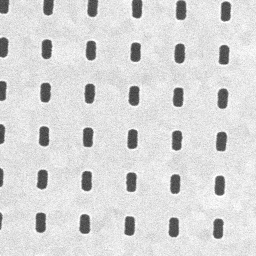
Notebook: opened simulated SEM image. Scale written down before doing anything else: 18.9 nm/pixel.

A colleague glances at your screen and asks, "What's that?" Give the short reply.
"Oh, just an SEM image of a regular array of holes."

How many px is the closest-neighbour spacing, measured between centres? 43.2